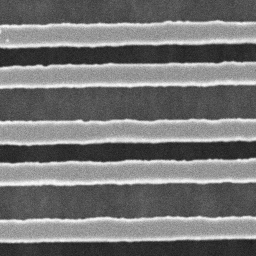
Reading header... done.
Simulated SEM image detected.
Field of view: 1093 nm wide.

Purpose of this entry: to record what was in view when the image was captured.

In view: lines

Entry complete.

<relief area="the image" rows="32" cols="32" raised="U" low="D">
DDDDDDDDDDDDDDDDDDDDDDDDDDDDDDDD
DDDDDDDDDDDDDDDDDDDDDDDDDDDDDDDD
DDDDDDDDDDDDDDDDDDDDDDDDDDDDDDDD
UUUUUUUUUUUUUUUUUUUUUUUUUUUUUUUU
UUUUUUUUUUUUUUUUUUUUUUUUUUUUUUUU
UUUUUUUUUUUUUUUUUUUUUUUUUUDDDDDD
DDDDDDDDDDDDDDDDDDDDDDDDDDDDDDDD
DDDDDDDDDDDDDDDDDDDDDDDDDDDDDDDD
UUUUUUUUUUUUUUUUUUUUUUUUUUUUUUUU
UUUUUUUUUUUUUUUUUUUUUUUUUUUUUUUU
UUUUUUUUUUUUUUUUUUUUUUUUUUUUUUUU
DDDDDDDDDDDDDDDDDDDDDDDDDDDDDDDD
DDDDDDDDDDDDDDDDDDDDDDDDDDDDDDDD
DDDDDDDDDDDDDDDDDDDDDDDDDDDDDDDD
DDDDDDDDDDDDDDDDDDDDDDDDDDDDDDDD
UUUUUUUUUUUUUUUUUUUUUUUUUUUUUUUU
UUUUUUUUUUUUUUUUUUUUUUUUUUUUUUUU
UUUUUUUUUUUUUUUUUUUUUUUUUUUUUUUU
DDDDDDDDDDDDDDDDDDDDDDDDDDDDDDDD
DDDDDDDDDDDDDDDDDDDDDDDDDDDDDDDD
UUUUUUUUUUUUUUUUUUUUUUUUUUUUUUUU
UUUUUUUUUUUUUUUUUUUUUUUUUUUUUUUU
UUUUUUUUUUUUUUUUUUUUUUUUUUUUUUUU
DDDDDDDDDDDDDDDDDDDDDDDDDDDDDDDD
DDDDDDDDDDDDDDDDDDDDDDDDDDDDDDDD
DDDDDDDDDDDDDDDDDDDDDDDDDDDDDDDD
DDDDDDDDDDDDDDDDDDDDDDDDDDDDDDDD
DDDDUUUUUUUUUUUUUUUUUUUUUUUUUUUU
UUUUUUUUUUUUUUUUUUUUUUUUUUUUUUUU
UUUUUUUUUUUUUUUUUUUUUUUUUUUUUUUU
DDDDDDDDDDDDDDDDDDDDDDDDDDDDDDDD
DDDDDDDDDDDDDDDDDDDDDDDDDDDDDDDD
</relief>